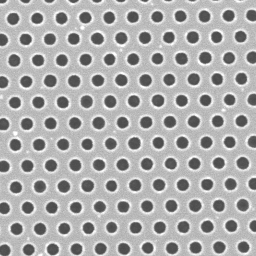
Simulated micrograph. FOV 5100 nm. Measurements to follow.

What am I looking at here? a regular array of holes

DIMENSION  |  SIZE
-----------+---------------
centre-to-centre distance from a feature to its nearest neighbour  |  471 nm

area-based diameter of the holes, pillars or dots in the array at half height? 252 nanometers